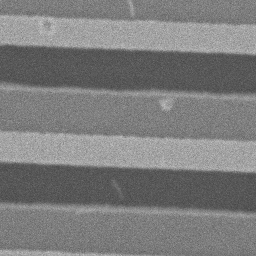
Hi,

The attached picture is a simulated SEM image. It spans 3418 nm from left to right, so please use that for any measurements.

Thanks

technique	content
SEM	lines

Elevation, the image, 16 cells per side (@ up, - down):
@@@@@@@@@@@@@@@@
@@@@@@@@@@@@@@@@
@@@@@@@@@@@@@@@@
----------------
----------------
@@--------------
@@@@@@@@@@@@@@@@
@@@@@@@@@@@@@@@@
@@@@@@@@@@@@@@@@
@@@@@@@@@@@@@@@@
----------@@@@@@
----------------
----------------
@@@@@@@@@@@@@@@@
@@@@@@@@@@@@@@@@
@@@@@@@@@@@@@@@@